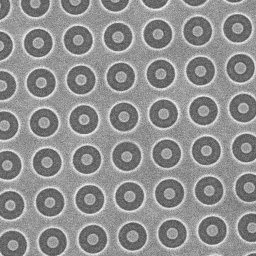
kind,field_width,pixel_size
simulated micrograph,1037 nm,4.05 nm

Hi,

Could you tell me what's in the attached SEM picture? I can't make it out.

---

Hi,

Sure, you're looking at an array of small figures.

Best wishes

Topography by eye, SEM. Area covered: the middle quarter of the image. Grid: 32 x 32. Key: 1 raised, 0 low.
11100111111100000111100000011110
11000001111000000111100110001100
10000000111001100011100110001110
10011000110001110011100110001110
10011000111000000011100000011111
10000000111000000111110000111111
11000001111110001111111111111111
11100111111111111111111111111111
11111111111111111111111111111111
11111111111111111111111000011111
11110011111100000111110000001110
11000000111100000011100011001110
11000000111000110001100011000110
10001100011000110001100011001111
10001100011100000011110000001111
11000000111100000011111000011111
11000000111110000111111111111111
11110011111111111111111111111111
11111111111111111111111111111111
11111111111111000111111100001111
11111001111110000011111000000111
11100000111100000001110001000111
11000000011100011001110011100111
11001110011100011001110001000111
11000110011100000001111000000111
11000000011110000001111100001111
11100000111111000111111111111111
11111011111111111111111111111111
11111111111111111111111111111111
11111111111111110111111100000111
11111000111111000001111000000011
11110000011110000000111000100011